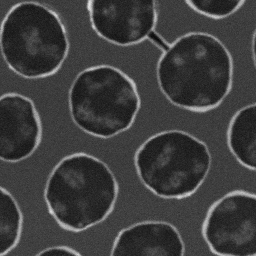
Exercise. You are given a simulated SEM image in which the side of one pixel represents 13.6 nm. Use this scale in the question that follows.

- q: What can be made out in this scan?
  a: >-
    holes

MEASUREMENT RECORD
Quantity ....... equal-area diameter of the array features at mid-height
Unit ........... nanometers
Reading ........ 923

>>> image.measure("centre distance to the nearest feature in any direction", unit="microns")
1.27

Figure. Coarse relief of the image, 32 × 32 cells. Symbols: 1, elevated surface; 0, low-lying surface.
11101111111100000001111100000011
11000011111100000001111110000111
10000001111100000001111111111111
00000000111100000001111111111111
00000000111110000000111000111111
00000000111111101111010000001111
00000000111111111111100000001111
10000000111111111111000000000111
11000001111110111111000000000111
11100111110000011111000000000111
11111111100000001111000000000111
11111111100000000111100000001111
00001111100000000111100000001111
00001111100000000111111100111110
00001111100000000111111111111000
00000111110000001111111111111000
00000111111000011111111111111000
00000111111111111110000011111000
00001111111111111100000000111000
00011111111111111000000000111100
11111111000001111000000000111110
11111110000000111000000000111111
11111100000000111100000001111111
11111100000000111110000011111111
01111100000000111111001111110001
00111100000000111111111111100000
00111110000000111111111111000000
00011110000011111111111111000000
00111111101111111000001111000000
00111111111111100000001111000000
00111111111111100000000111000000
11111100011111000000000111100000